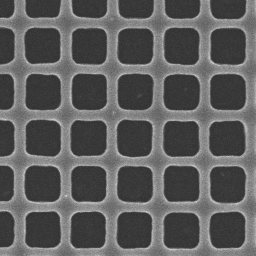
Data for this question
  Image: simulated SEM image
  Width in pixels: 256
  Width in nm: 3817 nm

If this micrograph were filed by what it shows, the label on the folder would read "a regular array of holes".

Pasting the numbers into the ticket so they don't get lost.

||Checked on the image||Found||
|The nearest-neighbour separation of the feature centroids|45.6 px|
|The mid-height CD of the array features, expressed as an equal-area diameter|590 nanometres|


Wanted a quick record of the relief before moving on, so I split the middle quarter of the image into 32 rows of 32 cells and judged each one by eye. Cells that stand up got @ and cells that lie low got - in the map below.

@@@@@@@@@@@@@@@@@@@@@@@@@@@@@@@@
@@@@@@@@@@@@@@@@@@@@@@@@@@@@@@@@
@@@@-----@@@@@@------@@@@@@---@@
@@--------@@@@--------@@@-------
@@---------@@---------@@@-------
@@---------@@---------@@@-------
@@---------@@---------@@@-------
@@---------@@---------@@@-------
@@---------@@---------@@@-------
@@---------@@---------@@@-------
@@--------@@@@--------@@@-------
@@@@----@@@@@@@@@---@@@@@@------
@@@@@@@@@@@@@@@@@@@@@@@@@@@@@@@@
@@@@@@@@@@@@@@@@@@@@@@@@@@@@@@@@
@@--------@@@@-------@@@@@------
@@---------@@---------@@@-------
@@---------@@---------@@@-------
@@---------@@---------@@@-------
@@---------@@---------@@@-------
@@---------@@---------@@@-------
@@---------@@---------@@@-------
@@--------@@@---------@@@-------
@@--------@@@@-------@@@@-------
@@@@@@@@@@@@@@@@@-@@@@@@@@@@@@@@
@@@@@@@@@@@@@@@@@@@@@@@@@@@@@@@@
@@@------@@@@@@@-@@@@@@@@@@-----
@@--------@@@@--------@@@-------
@@---------@@---------@@@-------
@----------@@---------@@@-------
@@---------@@---------@@@-------
@@---------@@---------@@@-------
@@---------@@---------@@@-------